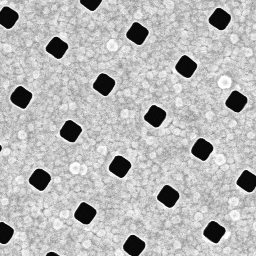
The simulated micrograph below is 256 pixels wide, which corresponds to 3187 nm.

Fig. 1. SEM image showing a regular array of holes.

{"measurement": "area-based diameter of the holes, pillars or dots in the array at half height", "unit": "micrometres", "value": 0.261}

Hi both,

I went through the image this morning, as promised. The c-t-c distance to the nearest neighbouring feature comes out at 0.716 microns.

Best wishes